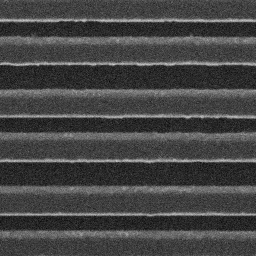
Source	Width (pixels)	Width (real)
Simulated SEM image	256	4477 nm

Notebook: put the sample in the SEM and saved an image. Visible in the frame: lines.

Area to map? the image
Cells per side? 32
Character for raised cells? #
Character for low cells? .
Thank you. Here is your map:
################################
################################
################################
................................
................................
################################
################################
################################
................................
................................
................................
................................
################################
################################
################################
................................
................................
################################
################################
################################
................................
................................
................................
................................
################################
################################
################################
................................
................................
################################
################################
################################